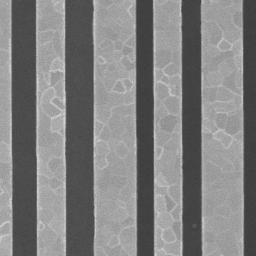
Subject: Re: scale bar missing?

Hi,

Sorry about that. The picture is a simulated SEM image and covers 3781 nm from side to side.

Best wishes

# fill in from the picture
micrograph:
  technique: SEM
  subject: lines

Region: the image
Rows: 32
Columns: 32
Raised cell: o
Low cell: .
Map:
o....ooo....ooooo..oooo..ooooo..
o....ooo....ooooo..oooo..ooooo..
o....ooo....ooooo..oooo..ooooo..
o....ooo....ooooo..oooo..ooooo..
o....ooo....ooooo..oooo..ooooo..
o....ooo....ooooo..oooo..ooooo..
o....ooo....ooooo..oooo..ooooo..
o....ooo....ooooo..oooo..ooooo..
o....ooo....ooooo..oooo..ooooo..
o....ooo....ooooo..oooo..ooooo..
o....ooo....ooooo..oooo..ooooo..
o....ooo....ooooo..oooo..ooooo..
o....ooo....ooooo..oooo..ooooo..
o....ooo....ooooo..oooo..ooooo..
o....ooo....ooooo..oooo..ooooo..
o....ooo....ooooo..oooo..ooooo..
o....ooo....ooooo..oooo..ooooo..
o....ooo....ooooo..oooo..ooooo..
o....ooo....ooooo..oooo..ooooo..
o....ooo....ooooo..oooo..ooooo..
o....ooo....ooooo..oooo..ooooo..
o....ooo....ooooo..oooo..ooooo..
o....ooo....ooooo..oooo..ooooo..
o....ooo....ooooo..oooo..ooooo..
o....ooo....ooooo..oooo..ooooo..
o....ooo....ooooo..oooo..ooooo..
o....ooo....ooooo..oooo..ooooo..
o....ooo....ooooo..oooo..ooooo..
o....ooo....ooooo..oooo..ooooo..
o....ooo....ooooo..oooo..ooooo..
o....ooo....ooooo..oooo..ooooo..
o....ooo....ooooo..oooo..ooooo..